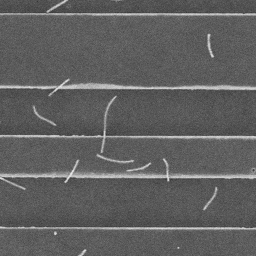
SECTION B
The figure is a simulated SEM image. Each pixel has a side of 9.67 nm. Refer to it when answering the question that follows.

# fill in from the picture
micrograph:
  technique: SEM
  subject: lines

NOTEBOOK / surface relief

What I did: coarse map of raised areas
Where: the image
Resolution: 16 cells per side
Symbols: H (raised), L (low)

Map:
LLLLLLLLLLLLLLLL
HHHHHHHHHHHHHHHH
HHHHHHHHHHHHHHHH
HHHHHHHHHHHHHHHH
HHHHHHHHHHHHHHHH
LLLHLLLLHHHHLLHH
LLLLLLLLLLLLLLLL
LLLLLLLLLLLLLLLL
HHHHLLHLLLLLLLLL
HHHHHHHHHHHHHHHH
HHHHHHHHHHHHHHHH
LLLLLLLLLLLLLLLL
LLLLLLLLLLLLLLLL
LLLLLLLLLLLLLLLL
HHHHHHHHHHHHHHHH
HHHHHHHHHHHHHHHH